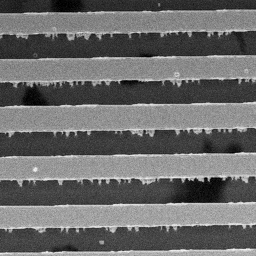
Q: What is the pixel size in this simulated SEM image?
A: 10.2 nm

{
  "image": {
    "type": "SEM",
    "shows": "lines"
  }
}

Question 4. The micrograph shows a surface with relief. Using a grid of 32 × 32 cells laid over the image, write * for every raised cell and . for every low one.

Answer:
................................
....................************
********************************
********************************
................................
................................
................................
********************************
********************************
********************************
................................
................................
................................
********************************
********************************
********************************
................................
................................
................................
..............******************
********************************
********************************
................................
................................
................................
.....................***********
********************************
********************************
***.*...........................
................................
................................
...............*****************